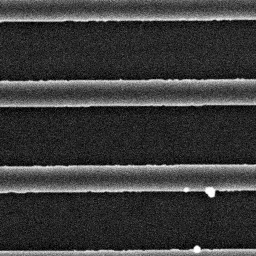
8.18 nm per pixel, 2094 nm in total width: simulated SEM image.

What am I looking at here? lines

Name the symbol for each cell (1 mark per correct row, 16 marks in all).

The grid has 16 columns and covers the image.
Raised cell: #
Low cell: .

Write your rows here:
################
................
................
................
................
################
################
................
................
................
################
################
................
................
................
................